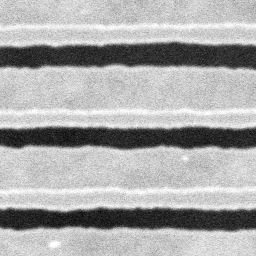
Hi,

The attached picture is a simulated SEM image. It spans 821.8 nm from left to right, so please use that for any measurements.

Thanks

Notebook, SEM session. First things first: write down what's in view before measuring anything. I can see lines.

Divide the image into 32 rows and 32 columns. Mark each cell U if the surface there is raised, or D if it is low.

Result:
UUUUUUUUUUUUUUUUUUUUUUUUUUUUUUUU
UUUUUUUUUUUUUUUUUUUUUUUUUUUUUUUU
UUUUUUUUUUUUUUUUUUUUUUUUUUUUUUUU
UUUUUUUUUUUUUUUUUUUUUUUUUUUUUUUU
UUUUUUUUUUUUUUUUUUUUUUUUUUUUUUUU
UUUUUUUUUUUUUUDDDDDDDDDDDUUUDDUU
DDDDDDDDDDDDDDDDDDDDDDDDDDDDDDDD
DDDDDDDDDDDDDDDDDDDDDDDDDDDDDDDD
DDDDDUUUUDDUDUUUUUUUUUUUUDDDDDDD
UUUUUUUUUUUUUUUUUUUUUUUUUUUUUUUU
UUUUUUUUUUUUUUUUUUUUUUUUUUUUUUUU
UUUUUUUUUUUUUUUUUUUUUUUUUUUUUUUU
UUUUUUUUUUUUUUUUUUUUUUUUUUUUUUUU
UUUUUUUUUUUUUUUUUUUUUUUUUUUUUUUU
UUUUUUUUUUUUUUUUUUUUUUUUUUUUUUUU
UUUUUUUUUUUUUUUUUUUUUUUUUUUUUUUU
DDDDDDDDDDDDDDDDDDDDDDDDDDDDDDDD
DDDDDDDDDDDDDDDDDDDDDDDDDDDDDDDD
UDDUUUUUDDUUUDDDDDDUUUDDDDUDDDDD
UUUUUUUUUUUUUUUUUUUUUUUUUUUUUUUU
UUUUUUUUUUUUUUUUUUUUUUUUUUUUUUUU
UUUUUUUUUUUUUUUUUUUUUUUUUUUUUUUU
UUUUUUUUUUUUUUUUUUUUUUUUUUUUUUUU
UUUUUUUUUUUUUUUUUUUUUUUUUUUUUUUU
UUUUUUUUUUUUUUUUUUUUUUUUUUUUUUUU
UUUUUUUUUUUUUUUUUUUUUUUUUUUUUUUU
DDDDDDDDDDDDDDDDDDDDDDDDDDDDDDDD
DDDDDDDDDDDDDDDDDDDDDDDDDDDDDDDD
DDDDDDDDUUDDDDDDDDDDDDDDDDDDDDDD
UUUUUUUUUUUUUUUUUUUUUUUUUUUUUUUU
UUUUUUUUUUUUUUUUUUUUUUUUUUUUUUUU
UUUUUUUUUUUUUUUUUUUUUUUUUUUUUUUU